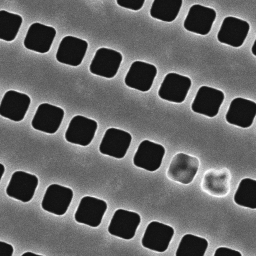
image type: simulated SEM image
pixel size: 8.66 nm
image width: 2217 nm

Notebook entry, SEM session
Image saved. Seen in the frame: a regular array of holes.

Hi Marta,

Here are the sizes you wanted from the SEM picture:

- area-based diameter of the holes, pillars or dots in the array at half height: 259 nm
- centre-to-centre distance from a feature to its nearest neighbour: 310 nm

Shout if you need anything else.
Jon